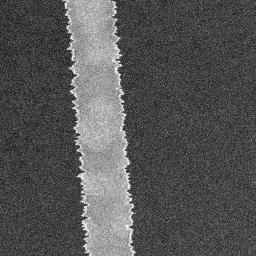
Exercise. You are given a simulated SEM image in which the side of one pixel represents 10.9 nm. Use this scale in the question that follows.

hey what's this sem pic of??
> one or a few lines or trenches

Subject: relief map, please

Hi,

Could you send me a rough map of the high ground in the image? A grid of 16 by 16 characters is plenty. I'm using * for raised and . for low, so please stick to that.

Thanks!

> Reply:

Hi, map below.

....***.........
....***.........
....***.........
.....**.........
.....**.........
.....***........
.....***........
.....***........
.....***........
.....***........
.....***........
.....***........
.....***........
.....***........
......**........
.....***........